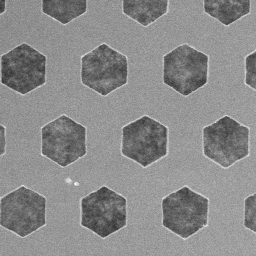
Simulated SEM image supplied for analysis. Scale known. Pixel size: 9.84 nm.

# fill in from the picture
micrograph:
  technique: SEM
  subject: holes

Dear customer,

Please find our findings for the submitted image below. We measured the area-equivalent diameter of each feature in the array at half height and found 464 nm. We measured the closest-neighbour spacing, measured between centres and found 799 nanometers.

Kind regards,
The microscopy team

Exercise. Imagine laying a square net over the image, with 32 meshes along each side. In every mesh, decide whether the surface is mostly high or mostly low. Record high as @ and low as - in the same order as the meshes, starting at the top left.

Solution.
-@@@@------@@@@------@@@@------@
@@@@@@-----@@@@------@@@@@-----@
@@@@@@@--@@@@@@@@--@@@@@@@@---@@
@@@@@@@@@@@@@@@@@@@@@@@@@@@@@@@@
@@@@@@@@@@@@@@@@@@@@@@@@@@@@@@@@
@@@@@@@@@@@@@@@@@@@@@@@@@@@@@@@@
@----@@@@@@----@@@@@@----@@@@@@@
------@@@@------@@@@------@@@@@-
------@@@@------@@@@------@@@@@-
------@@@@------@@@@------@@@@@-
-----@@@@@@-----@@@@@-----@@@@@-
@@--@@@@@@@@--@@@@@@@@--@@@@@@@@
@@@@@@@@@@@@@@@@@@@@@@@@@@@@@@@@
@@@@@@@@@@@@@@@@@@@@@@@@@@@@@@@@
@@@@@@@@@@@@@@@@@@@@@@@@@@@@@@@@
@@@@@@----@@@@@@----@@@@@@----@@
-@@@@------@@@@------@@@@------@
-@@@@------@@@@------@@@@------@
-@@@@------@@@@------@@@@------@
@@@@@@----@@@@@@----@@@@@@-----@
@@@@@@@--@@@@@@@@@-@@@@@@@@--@@@
@@@@@@@@@@@@@@@@@@@@@@@@@@@@@@@@
@@@@@@@@@@@@@@@@@@@@@@@@@@@@@@@@
@@-@@@@@@@@@@@@@@@@@@@@@@@@@@@@@
@----@@@@@@----@@@@@@----@@@@@@-
------@@@@------@@@@------@@@@@-
------@@@@------@@@@------@@@@@-
------@@@@------@@@@------@@@@@-
@----@@@@@@----@@@@@@----@@@@@@-
@@@@@@@@@@@@-@@@@@@@@@@-@@@@@@@@
@@@@@@@@@@@@@@@@@@@@@@@@@@@@@@@@
@@@@@@@@@@@@@@@@@@@@@@@@@@@@@@@@